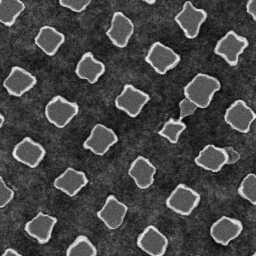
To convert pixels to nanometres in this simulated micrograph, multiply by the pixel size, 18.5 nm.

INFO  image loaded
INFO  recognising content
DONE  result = a regular array of raised bodies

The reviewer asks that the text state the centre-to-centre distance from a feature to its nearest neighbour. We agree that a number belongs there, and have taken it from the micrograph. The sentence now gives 921 nanometers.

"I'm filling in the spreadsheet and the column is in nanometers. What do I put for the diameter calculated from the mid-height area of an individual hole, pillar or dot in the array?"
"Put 504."